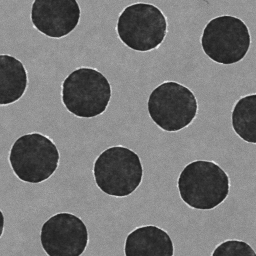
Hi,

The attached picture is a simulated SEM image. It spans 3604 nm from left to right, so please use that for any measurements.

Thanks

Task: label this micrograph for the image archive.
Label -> holes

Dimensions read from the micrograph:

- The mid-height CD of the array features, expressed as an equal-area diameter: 683 nm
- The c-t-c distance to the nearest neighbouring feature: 1190 nm